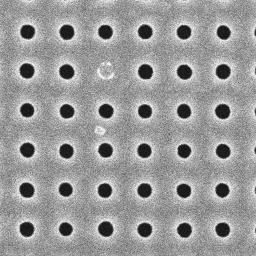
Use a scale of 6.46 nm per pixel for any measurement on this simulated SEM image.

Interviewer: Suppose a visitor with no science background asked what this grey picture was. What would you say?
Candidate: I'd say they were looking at a regular array of holes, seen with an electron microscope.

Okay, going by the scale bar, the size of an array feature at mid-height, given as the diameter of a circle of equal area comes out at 97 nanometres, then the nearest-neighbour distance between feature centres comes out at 0.25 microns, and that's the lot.